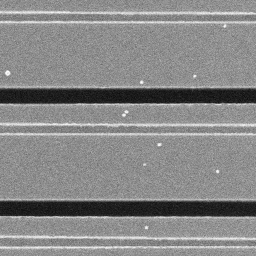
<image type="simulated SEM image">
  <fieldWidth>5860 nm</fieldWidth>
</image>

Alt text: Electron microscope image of lines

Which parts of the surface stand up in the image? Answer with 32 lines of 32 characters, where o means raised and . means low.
oooooooooooooooooooooooooooooooo
oooooooooooooooooooooooooooooooo
oooooooooooooooooooooooooooooooo
oooooooooooooooooooooooooooooooo
oooooooooooooooooooooooooooooooo
oooooooooooooooooooooooooooooooo
oooooooooooooooooooooooooooooooo
oooooooooooooooooooooooooooooooo
oooooooooooooooooooooooooooooooo
oooooooooooooooooooooooooooooooo
oooooooooooooooooooooooooooooooo
................................
................................
oooooooooooooooooooooooooooooooo
oooooooooooooooooooooooooooooooo
oooooooooooooooooooooooooooooooo
oooooooooooooooooooooooooooooooo
oooooooooooooooooooooooooooooooo
oooooooooooooooooooooooooooooooo
oooooooooooooooooooooooooooooooo
oooooooooooooooooooooooooooooooo
oooooooooooooooooooooooooooooooo
oooooooooooooooooooooooooooooooo
oooooooooooooooooooooooooooooooo
oooooooooooooooooooooooooooooooo
................................
................................
oooooooooooooooooooooooooooooooo
oooooooooooooooooooooooooooooooo
oooooooooooooooooooooooooooooooo
oooooooooooooooooooooooooooooooo
oooooooooooooooooooooooooooooooo